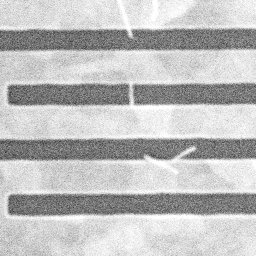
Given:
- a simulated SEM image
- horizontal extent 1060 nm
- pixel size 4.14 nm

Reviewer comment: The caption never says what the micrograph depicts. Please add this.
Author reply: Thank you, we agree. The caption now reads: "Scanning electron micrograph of groups of lines, slits or small figures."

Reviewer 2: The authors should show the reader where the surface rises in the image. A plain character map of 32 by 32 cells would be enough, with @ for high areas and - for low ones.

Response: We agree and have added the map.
@@@@@@@@@@@@@@@@@@@@@@@@@@@@@@@@
@@@@@@@@@@@@@@@@@@@@@@@@@@@@@@@@
@@@@@@@@@@@@@@@@@@@@@@@@@@@@@@@@
@@@@-@@@@@@@@@-@@---------------
--------------------------------
--------------------------------
@@@@@@@@@@@@@@@@@@@@@@@@@@@@@@@@
@@@@@@@@@@@@@@@@@@@@@@@@@@@@@@@@
@@@@@@@@@@@@@@@@@@@@@@@@@@@@@@@@
@@@@@@@@@@@@@@@@@@@@@@@@@@@@@@@@
@@--------------@---------------
@-------------------------------
@-------------------------------
@@@@@@@@@@@@@@@@@@@@@@@@@@@@@@@@
@@@@@@@@@@@@@@@@@@@@@@@@@@@@@@@@
@@@@@@@@@@@@@@@@@@@@@@@@@@@@@@@@
@@@@@@@@@@@@@@@@@@@@@@@@@@@@@@@@
--------------------------------
--------------------------------
--------------------------------
@@@@@@@@@@@@@@@@@@@@@@@@@@@@@@@@
@@@@@@@@@@@@@@@@@@@@@@@@@@@@@@@@
@@@@@@@@@@@@@@@@@@@@@@@@@@@@@@@@
@@@@@@@@@@@@@@@@@@@@@@@@@@@@@@@@
@-------------------------------
@-------------------------------
@-------------------------------
@@@@@@@@@@@@@@@@@@@@@@@@@@@@@@@@
@@@@@@@@@@@@@@@@@@@@@@@@@@@@@@@@
@@@@@@@@@@@@@@@@@@@@@@@@@@@@@@@@
@@@@@@@@@@@@@@@@@@@@@@@@@@@@@@@@
@@@@@@@@@@@@@@@@@@@@@@@@@@@@@@@@